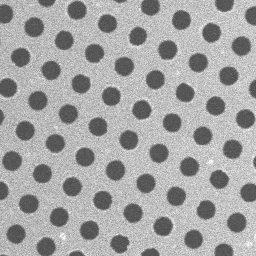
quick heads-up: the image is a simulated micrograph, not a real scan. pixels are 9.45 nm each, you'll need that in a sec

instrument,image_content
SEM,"a regular array of holes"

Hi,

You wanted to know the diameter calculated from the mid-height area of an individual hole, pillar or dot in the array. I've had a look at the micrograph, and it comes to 183 nanometers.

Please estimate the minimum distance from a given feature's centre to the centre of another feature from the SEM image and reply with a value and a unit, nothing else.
308 nm